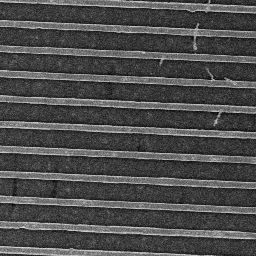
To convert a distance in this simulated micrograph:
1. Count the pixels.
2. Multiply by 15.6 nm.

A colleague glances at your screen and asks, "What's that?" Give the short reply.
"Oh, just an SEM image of parallel lines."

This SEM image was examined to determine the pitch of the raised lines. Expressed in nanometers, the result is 392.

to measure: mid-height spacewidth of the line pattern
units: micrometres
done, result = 0.299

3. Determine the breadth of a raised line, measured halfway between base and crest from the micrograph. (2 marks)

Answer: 95.6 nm